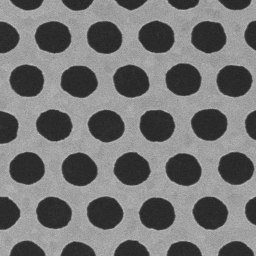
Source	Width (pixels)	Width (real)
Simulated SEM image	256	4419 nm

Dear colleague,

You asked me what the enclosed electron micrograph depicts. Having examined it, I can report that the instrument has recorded a regular array of holes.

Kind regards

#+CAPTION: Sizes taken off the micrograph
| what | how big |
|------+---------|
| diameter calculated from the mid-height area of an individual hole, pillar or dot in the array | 599 nm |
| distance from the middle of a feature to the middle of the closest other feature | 0.869 microns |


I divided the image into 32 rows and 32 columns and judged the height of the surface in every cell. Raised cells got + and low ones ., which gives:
++...+++...++++...+++....+++...+
++++++++++++++++++++++++++++++++
++++++++++++++++++++++++++++++++
..+++....++....+++...+++....+++.
..++.....++....++.....++....+++.
..+++....++....+++....++....+++.
.+++++..++++..+++++..++++..+++++
++++++++++++++++++++++++++++++++
++...++++..++++...+++....+++...+
+....+++....++....+++....++....+
+....+++....++.....++....++.....
++...+++....+++...+++....+++...+
++++++++++++++++++++++++++++++++
++++++++++++++++++++++++++++++++
..+++....++....+++...+++....+++.
..++.....++.....+.....++....+++.
..+++....++.....++....++....+++.
..++++..++++...+++...++++..+++++
++++++++++++++++++++++++++++++++
++...+++...++++...++++..++++...+
+.....++....++.....++....++.....
+.....++....++.....++....++.....
++...+++....+++...+++....+++...+
++++++++++++++++++++++++++++++++
++++++++++++++++++++++++++++++++
..+++....++....+++...+++....+++.
...++....++....++.....++.....++.
..+++....++....+++....++....+++.
.+++++..++++..++++...++++..+++++
++++++++++++++++++++++++++++++++
++...+++...++++...++++..++++...+
+.....++....++.....++....++.....